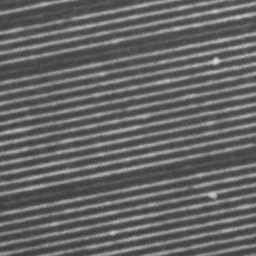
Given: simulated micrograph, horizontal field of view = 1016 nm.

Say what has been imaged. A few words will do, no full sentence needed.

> parallel lines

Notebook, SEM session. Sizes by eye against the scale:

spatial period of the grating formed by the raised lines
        39.2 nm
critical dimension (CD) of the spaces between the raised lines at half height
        32.7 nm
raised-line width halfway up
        6.3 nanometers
